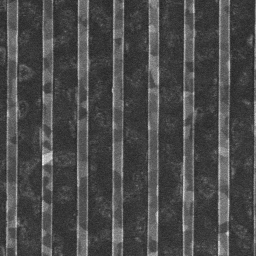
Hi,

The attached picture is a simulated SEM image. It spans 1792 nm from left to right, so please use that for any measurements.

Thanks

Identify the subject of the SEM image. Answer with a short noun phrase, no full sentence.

parallel lines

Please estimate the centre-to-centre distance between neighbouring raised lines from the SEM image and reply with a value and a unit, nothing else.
35.3 pixels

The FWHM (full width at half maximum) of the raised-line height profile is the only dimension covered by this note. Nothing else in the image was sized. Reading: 0.0648 micrometres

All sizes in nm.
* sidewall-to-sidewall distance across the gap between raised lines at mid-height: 180